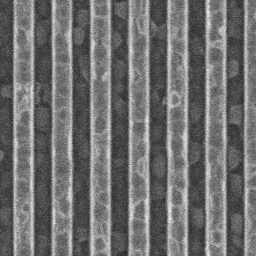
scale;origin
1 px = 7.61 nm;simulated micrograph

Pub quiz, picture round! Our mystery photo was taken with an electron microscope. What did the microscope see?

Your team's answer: parallel lines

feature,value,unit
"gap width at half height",20.1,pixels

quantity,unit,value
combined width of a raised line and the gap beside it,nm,293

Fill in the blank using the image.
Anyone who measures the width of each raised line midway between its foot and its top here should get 141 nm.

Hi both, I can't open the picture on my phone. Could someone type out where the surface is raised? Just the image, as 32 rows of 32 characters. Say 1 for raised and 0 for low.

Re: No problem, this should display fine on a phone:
00110001100111001100011000110001
00110001100111001100011000110001
00110001100111001100011000110001
00110001100111001100011000110001
00110001100111001100011000110001
00110001100111001100011000110001
00110001100111001100011000110001
00110001100111001100011000110001
00110001100111001100011000110001
00110001100111001100011000110001
00110001100111001100011000110001
00110001100111001100011000110001
00110001100111001100011000110001
00110001100111001100011000110001
00110001100111001100011000110001
00110001100111001100011000110001
00110001100111001100011000110001
00110001100111001100011000110001
00110001100111001100011000110001
00110001100111001100011000110001
00110001100111001100011000110001
00110001100111001100011000110001
00110001100111001100011000110001
00110001100111001100011000110001
00110001100111001100011000110001
00110001100111001100011000110001
00110001100111001100011000110001
00110001100111001100011000110001
00110001100111001100011000110001
00110001100111001100011000110001
00110001100111001100011000110001
00110001100111001100011000110001